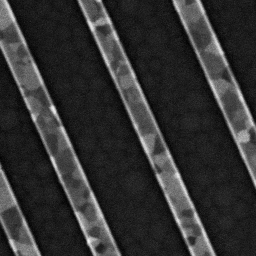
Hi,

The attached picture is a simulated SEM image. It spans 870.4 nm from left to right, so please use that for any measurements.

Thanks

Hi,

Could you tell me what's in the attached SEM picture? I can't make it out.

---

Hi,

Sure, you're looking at one or a few lines or trenches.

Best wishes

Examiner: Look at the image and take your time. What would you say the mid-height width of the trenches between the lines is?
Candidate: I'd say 230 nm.